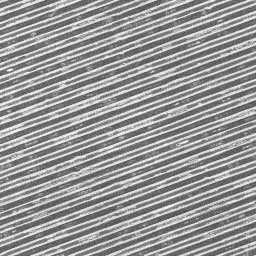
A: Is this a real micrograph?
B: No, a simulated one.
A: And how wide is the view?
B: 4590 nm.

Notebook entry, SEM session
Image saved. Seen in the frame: parallel lines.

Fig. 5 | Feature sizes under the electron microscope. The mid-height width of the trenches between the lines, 133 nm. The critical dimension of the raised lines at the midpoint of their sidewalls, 99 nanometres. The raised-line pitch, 228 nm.